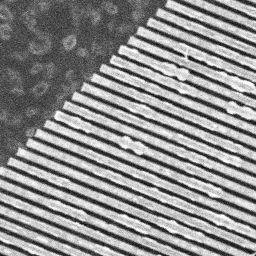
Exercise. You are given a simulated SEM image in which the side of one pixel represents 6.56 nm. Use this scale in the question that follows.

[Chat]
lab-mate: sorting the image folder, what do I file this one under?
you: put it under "parallel lines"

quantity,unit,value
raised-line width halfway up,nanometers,45.6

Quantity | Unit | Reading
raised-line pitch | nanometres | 79.2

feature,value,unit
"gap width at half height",5.09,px